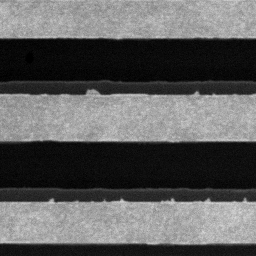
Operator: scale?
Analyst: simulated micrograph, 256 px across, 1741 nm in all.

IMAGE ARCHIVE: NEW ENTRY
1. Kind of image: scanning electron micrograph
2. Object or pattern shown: lines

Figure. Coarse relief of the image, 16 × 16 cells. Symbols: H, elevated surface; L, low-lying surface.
HHHHHHHHHHHHHHHH
HHHHHHHHHHHHHHHH
LLLLLLLLLLLLLLLL
LLLLLLLLLLLLLLLL
LLLLLLLLLLLLLLLL
HHHHHHHHHHHHHHHH
HHHHHHHHHHHHHHHH
HHHHHHHHHHHHHHHH
HHHHHHHHHHHHHHHH
LLLLLLLLLLLLLLLL
LLLLLLLLLLLLLLLL
LLLLLLLLLLLLLLLL
HHHHHHHHHHHHHHHH
HHHHHHHHHHHHHHHH
HHHHHHHHHHHHHHHH
LLLLLLLLLLLLLLLL